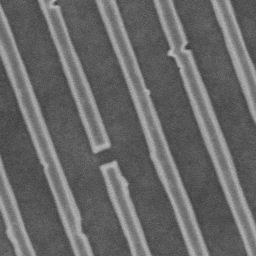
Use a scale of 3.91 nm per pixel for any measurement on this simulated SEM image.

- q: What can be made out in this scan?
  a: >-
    parallel lines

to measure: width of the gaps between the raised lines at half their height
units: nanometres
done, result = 152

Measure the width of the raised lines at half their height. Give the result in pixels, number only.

15.3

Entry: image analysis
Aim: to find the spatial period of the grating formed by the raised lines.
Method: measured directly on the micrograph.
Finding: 54.1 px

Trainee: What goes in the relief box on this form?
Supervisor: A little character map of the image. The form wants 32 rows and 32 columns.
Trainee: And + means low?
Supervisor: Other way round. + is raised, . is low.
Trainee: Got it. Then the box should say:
.....++.....++......++.....++...
......+......++.....++.....++...
+.....++.....++.....++.....++...
+.....++.....+++....+++.....++..
++.....++.....++.....++.....++..
++.....++.....++.....++......+..
++.....++......++....+++.....++.
.++.....++.....++.....++.....++.
.++.....++.....++.....++......++
.++.....++......++.....++.....++
..++.....++.....++.....++.....++
..++.....++.....+++....+++.....+
..++.....+++.....++.....++.....+
...++.....++.....++.....++.....+
...++.....++.....++......++.....
...++......++.....++.....++.....
....++.....++.....++.....+++....
....++.....++......++.....++....
....+++.....+......++.....++....
.....++............++......++...
.....++............+++.....++...
......++.....++.....++.....++...
+.....++.....++.....++......++..
+.....++......++.....++.....++..
++.....++.....++.....++.....++..
++.....++.....++.....+++.....++.
++......+......++.....++.....++.
.++.....++.....++.....++......+.
.++.....++.....+++.....++.....++
.++......+......++.....++.....++
..++.....++.....++.....++......+
..++.....++.....+++.....++.....+